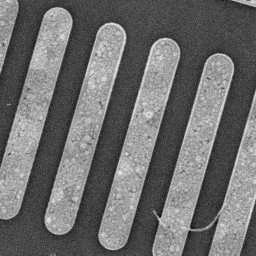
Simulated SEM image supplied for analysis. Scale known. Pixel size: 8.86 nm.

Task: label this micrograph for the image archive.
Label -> groups of lines, slits or small figures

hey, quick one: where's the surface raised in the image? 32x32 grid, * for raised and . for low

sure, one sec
**.............................*
**....**........................
**...****.......................
**...****....**.................
*....****...****................
*...****....***....***..........
*...****....***....***..........
*...****...****....***....***...
....***....****...****....***...
...****....***....****...****...
...****...****....***....****...
...****...****...****....***....
..****....****...****...****....
..****....***....***....****...*
..****...****....***....***....*
..***....****...****....***....*
.****....***....****...****....*
.****...****....***....****...**
.****...****...****....***....**
.***....****...****...****....**
****....***....****...****...***
****...****...****....****...***
****...****...****...****....***
***....****...****...****....***
***...****....***....****...****
***...****...****....***....****
**....****...****...****...****.
......***....****...****...****.
......***....***....****...****.
............****....***....****.
.............***...****....***..
...................****...****..